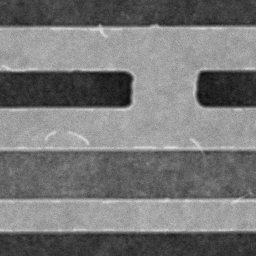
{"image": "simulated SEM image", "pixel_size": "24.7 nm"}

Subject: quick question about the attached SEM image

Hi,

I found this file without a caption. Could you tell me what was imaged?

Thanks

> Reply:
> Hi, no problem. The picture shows one or a few lines or trenches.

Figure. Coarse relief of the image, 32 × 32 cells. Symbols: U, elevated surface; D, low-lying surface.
DDDDDDDDDDDDDDDDDDDDDDDDDDDDDDDD
DDDDDDDDDDDDDDDDDDDDDDDDDDDDDDDD
DDDDDDDDDDDDDDDDDDDDDDDDDDDDDDDD
UUUUUUUUUUUUUUUUUUUUUUUUUUUUUUUU
UUUUUUUUUUUUUUUUUUUUUUUUUUUUUUUU
UUUUUUUUUUUUUUUUUUUUUUUUUUUUUUUU
UUUUUUUUUUUUUUUUUUUUUUUUUUUUUUUU
UUUUUUUUUUUUUUUUUUUUUUUUUUUUUUUU
UUUUUUUUUUUUUUUUUUUUUUUUUUUUUUUU
DDDDDDDDDDDDDDDDDUUUUUUUUDDDDDDD
DDDDDDDDDDDDDDDDDUUUUUUUUDDDDDDD
DDDDDDDDDDDDDDDDDUUUUUUUUDDDDDDD
DDDDDDDDDDDDDDDDDUUUUUUUUDDDDDDD
DDDDDDDUUUUUUUUUUUUUUUUUUUUUUUUU
UUUUUUUUUUUUUUUUUUUUUUUUUUUUUUUU
UUUUUUUUUUUUUUUUUUUUUUUUUUUUUUUU
UUUUUUUUUUUUUUUUUUUUUUUUUUUUUUUU
UUUUUUUUUUUUUUUUUUUUUUUUUUUUUUUU
UUUUUUUUUUUUUUUUUUUUUUUUUUUUUUUU
DDDDDDDDDDDDDDDDDDDDDDDDDDDDDDDD
DDDDDDDDDDDDDDDDDDDDDDDDDDDDDDDD
DDDDDDDDDDDDDDDDDDDDDDDDDDDDDDDD
DDDDDDDDDDDDDDDDDDDDDDDDDDDDDDDD
DDDDDDDDDDDDDDDDDDDDDDDDDDDDDDDD
DDDDDDDDDDDDDDDDDDDDDDDDDDDDDDDD
UUUUUUUUUUUUUUUUUUUUUUUUUUUUUUUU
UUUUUUUUUUUUUUUUUUUUUUUUUUUUUUUU
UUUUUUUUUUUUUUUUUUUUUUUUUUUUUUUU
UUUUUUUUUUUUUUUUUUUUUUUUUUUUUUUU
DDDDDDDDDDDDDDDDDDDDDDDDDDDDDDDD
DDDDDDDDDDDDDDDDDDDDDDDDDDDDDDDD
DDDDDDDDDDDDDDDDDDDDDDDDDDDDDDDD